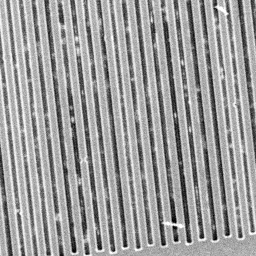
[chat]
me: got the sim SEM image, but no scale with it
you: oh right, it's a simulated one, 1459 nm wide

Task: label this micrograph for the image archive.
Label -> parallel lines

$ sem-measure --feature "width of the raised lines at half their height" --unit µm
0.0396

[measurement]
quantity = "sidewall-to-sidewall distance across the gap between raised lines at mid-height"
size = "29.7 nm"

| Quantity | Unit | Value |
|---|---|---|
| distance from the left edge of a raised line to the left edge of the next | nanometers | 73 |